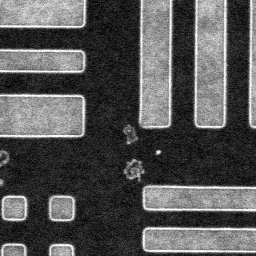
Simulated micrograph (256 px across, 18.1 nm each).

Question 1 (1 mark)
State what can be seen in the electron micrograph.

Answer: groups of lines, slits or small figures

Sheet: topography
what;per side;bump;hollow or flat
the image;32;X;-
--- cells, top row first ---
-----------XXXXXXX---XXXX---XXX-
-----------XXXXXXX---XXXX---XXX-
-----------XXXXXXX---XXXX---XXX-
XXXXXXXXXXXXXXXXXX---XXXX---XXX-
XXXXXXXXXXXXXXXXXX---XXXX---XXX-
XXXXXXXXXXXXXXXXXX---XXXX---XXX-
----------XXXXXXXX---XXXX---XXX-
-----------XXXXXXX---XXXX---XXX-
----------XXXXXXXX---XXXX---XXX-
XXXXXXXXXXXXXXXXXX---XXXX---XXX-
XXXXXXXXXXXXXXXXXX---XXXX---XXX-
XXXXXXXXXXXXXXXXXX---XXX----XXX-
----------XXXXXXXX---XXX----XXX-
----------XXXXXXXX---XXX----XXX-
----------XXXXXXXX---XXX----XXX-
----------XXXXXXXX---XXXX---XXX-
----------XXXXXXXXXXXXXXXXXXXXXX
XXXXXXXXXXXXXXXXXXXXXXXXXXXXXXXX
XXXXXXXXXXXXXXXXXXXXXXXXXXXXXXXX
XXXXXXXXXXXXXXXXXXXXXXXXXXXXXXXX
XXXXXXXXXXXXXXXXXXXXXXXXXXXXXXXX
XXXXXXXXXXXXXXXXXXXXXXXXXXXXXXXX
XXXXXXXXXXXXXXXXXXXXXXXXXXXXXXXX
XXXXXXXXXXXXXXXXXX--------------
XXXXXXXXXXXXXXXXXX--------------
---XXX---XXXXXXXXX--------------
---XXX---XXXXXXXXXXXXXXXXXXXXXXX
XXXXXXX-XXXXXXXXXXXXXXXXXXXXXXXX
XXXXXXXXXXXXXXXXXXXXXXXXXXXXXXXX
XXXXXXXXXXXXXXXXXX--------------
XXXXXXXXXXXXXXXXXX--------------
---XXX---XXXXXXXXXXXXXXXXXXXXXXX